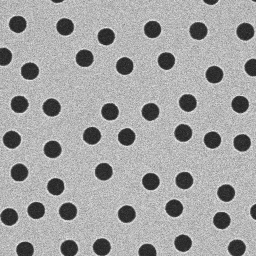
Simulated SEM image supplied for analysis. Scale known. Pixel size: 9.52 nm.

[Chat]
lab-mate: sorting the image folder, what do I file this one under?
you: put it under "a regular array of holes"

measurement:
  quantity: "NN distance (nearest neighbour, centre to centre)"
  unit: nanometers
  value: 306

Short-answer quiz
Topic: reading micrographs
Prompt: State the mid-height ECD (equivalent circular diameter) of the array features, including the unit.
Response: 164 nm